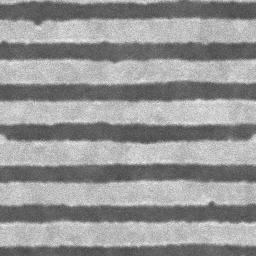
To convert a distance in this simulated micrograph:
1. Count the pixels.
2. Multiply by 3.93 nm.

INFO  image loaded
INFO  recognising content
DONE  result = parallel lines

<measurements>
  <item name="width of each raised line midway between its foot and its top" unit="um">0.0846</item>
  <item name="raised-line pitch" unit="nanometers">160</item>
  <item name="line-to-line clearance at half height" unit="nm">73.8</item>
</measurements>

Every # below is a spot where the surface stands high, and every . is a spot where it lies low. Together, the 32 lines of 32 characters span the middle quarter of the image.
################################
################################
################################
################################
###################.#...........
................................
................................
................................
................................
...............#...##......#####
################################
################################
################################
################################
...........######..#############
................................
................................
................................
................................
#...##....#...................#.
################################
################################
################################
################################
######################.####.####
................................
................................
................................
................................
...................##....#######
################################
################################